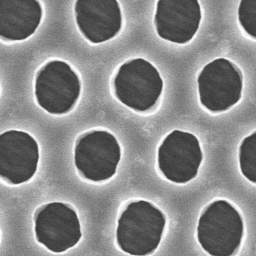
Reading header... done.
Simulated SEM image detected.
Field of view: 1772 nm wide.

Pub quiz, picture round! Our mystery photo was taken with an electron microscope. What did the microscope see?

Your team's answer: holes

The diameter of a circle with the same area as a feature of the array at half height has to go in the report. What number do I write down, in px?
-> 49.2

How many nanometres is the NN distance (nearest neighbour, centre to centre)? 563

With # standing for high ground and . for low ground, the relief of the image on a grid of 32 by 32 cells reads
.....####......#####.....#####..
.....####......####......#####..
.....####......####......#####..
.....#####.....####......#####..
....######....######....#######.
################################
################################
#################.#########.####
#####....######....######.....##
####......####......#####.....##
####......####......#####.....##
####......####......#####.....##
#####.....#####.....#####.....##
#####....#######...#######...###
################################
################################
...########..########..#########
....######.....#####.....#####..
.....####......#####.....#####..
.....####......#####.....#####..
.....####......#####.....#####..
....######....######.....#####..
#...########.########...#######.
################################
################################
######..########...#######...###
####.....######.....#####.....##
####......#####......####.....##
####......#####......####.....##
####......#####.....#####.....##
#####....######.....#####.....##
#######.########...#######....##